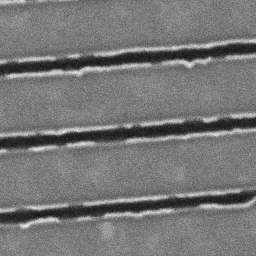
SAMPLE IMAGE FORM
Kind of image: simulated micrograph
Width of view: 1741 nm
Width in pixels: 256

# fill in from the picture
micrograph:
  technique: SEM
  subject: one or a few lines or trenches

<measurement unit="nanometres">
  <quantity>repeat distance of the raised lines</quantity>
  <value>502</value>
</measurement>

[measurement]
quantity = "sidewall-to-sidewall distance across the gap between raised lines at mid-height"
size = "373 nm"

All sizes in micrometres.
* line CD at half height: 0.131